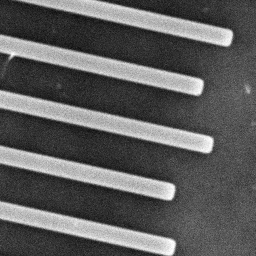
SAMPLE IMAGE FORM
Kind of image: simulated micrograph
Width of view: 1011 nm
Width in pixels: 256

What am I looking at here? groups of lines, slits or small figures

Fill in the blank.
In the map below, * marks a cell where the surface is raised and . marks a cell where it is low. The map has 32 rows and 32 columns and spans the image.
.....*********..................
.........*********..............
.............**********.........
..................**********....
......................*******...
*****......................**...
**********......................
....**********..................
.........**********.............
..............*********.........
..................*******.......
*......................**.......
*****...........................
**********......................
.....*********..................
.........**********.............
..............**********........
..................*********.....
*......................***......
******..........................
**********......................
.....**********.................
..........*********.............
..............********..........
...................***..........
*...............................
******..........................
.*********......................
.....**********.................
..........*********.............
..............********..........
...................***..........